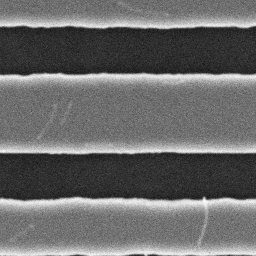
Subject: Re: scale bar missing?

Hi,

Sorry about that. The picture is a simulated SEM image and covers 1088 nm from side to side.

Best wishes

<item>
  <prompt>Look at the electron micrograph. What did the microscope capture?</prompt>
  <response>lines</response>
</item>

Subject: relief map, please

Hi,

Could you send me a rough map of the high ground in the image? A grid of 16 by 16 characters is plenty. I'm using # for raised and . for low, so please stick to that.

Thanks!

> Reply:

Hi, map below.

################
################
................
................
................
################
################
################
################
##########.#####
................
................
#..######..#####
################
################
################